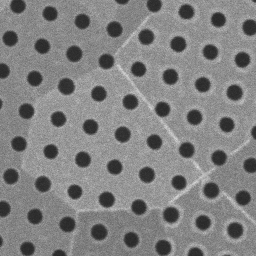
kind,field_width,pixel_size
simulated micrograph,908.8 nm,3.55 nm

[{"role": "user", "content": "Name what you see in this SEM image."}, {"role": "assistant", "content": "a regular array of holes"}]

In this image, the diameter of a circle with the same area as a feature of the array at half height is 55.9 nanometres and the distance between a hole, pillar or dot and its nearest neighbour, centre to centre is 116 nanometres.